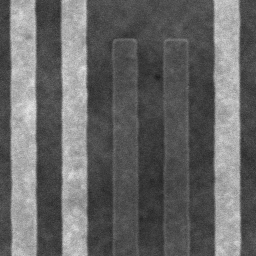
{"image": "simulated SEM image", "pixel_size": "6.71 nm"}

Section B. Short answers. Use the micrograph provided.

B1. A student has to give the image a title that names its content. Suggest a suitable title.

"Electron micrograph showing groups of lines, slits or small figures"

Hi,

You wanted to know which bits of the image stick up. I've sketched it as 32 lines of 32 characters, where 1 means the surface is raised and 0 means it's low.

01110000111000000000000000011100
01110000111000000000000000011100
01110000111000000000000000011100
01110000111000000000000000011100
01110000111000000000000000011100
00110000111000111000011000011100
00110000111000111000011000011100
00110000111000111000011000011100
00110000111000111000011000011100
00110000111000111000011000011100
00110000111000111000011000011100
00110000111000111000011000011100
00110000111000111000011000011100
00110000111000111000011000011100
00110000111000111000011000011100
01110000111000111000011000011100
00110000111000111000011000011100
00110000111000111000011000011100
00110000111000111000011000011100
00110000111000111000011000011100
00110000111000111000011000011100
00110000111000111000011000011100
00110000111000111000011000011100
00110000111000111000011000011100
00110000111000111000011000011100
00110000111000111000011000011100
00110000111000111000011000011100
00110000111000111000011100011100
00110000111000111000011100011100
00110000111000111000011100011100
00110000111000111000011100011100
00110000111000111000011100011100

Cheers